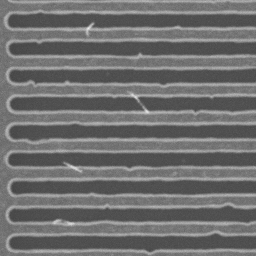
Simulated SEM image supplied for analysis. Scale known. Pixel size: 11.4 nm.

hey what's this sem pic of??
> parallel lines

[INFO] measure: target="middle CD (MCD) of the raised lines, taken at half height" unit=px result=12.5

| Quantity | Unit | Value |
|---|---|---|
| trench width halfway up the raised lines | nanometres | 177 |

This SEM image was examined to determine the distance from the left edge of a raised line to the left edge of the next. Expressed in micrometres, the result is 0.317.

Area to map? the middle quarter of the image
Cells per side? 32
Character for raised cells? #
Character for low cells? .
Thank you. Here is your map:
################################
................................
................................
................................
................................
################################
################################
################################
................................
................................
................................
................................
################################
################################
################################
................................
................................
................................
................................
################################
################################
################################
................................
................................
................................
.#..............................
################################
################################
################################
................................
................................
................................